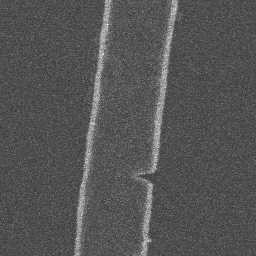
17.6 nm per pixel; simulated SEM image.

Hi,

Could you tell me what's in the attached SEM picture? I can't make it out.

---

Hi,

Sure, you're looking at one or a few lines or trenches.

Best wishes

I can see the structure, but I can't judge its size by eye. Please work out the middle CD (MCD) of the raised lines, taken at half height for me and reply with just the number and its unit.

1160 nm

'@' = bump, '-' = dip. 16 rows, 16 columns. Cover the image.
-------@@@@-----
-------@@@@-----
------@@@@@-----
------@@@@------
------@@@@------
------@@@@------
------@@@@------
------@@@@------
------@@@@------
------@@@@------
-----@@@@-------
-----@@@@-------
-----@@@@-------
-----@@@@-------
-----@@@@-------
-----@@@@-------